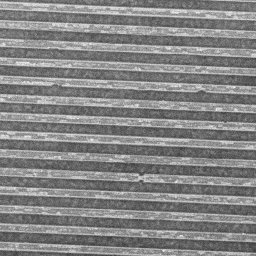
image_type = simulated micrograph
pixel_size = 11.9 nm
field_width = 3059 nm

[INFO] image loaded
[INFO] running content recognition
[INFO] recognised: parallel lines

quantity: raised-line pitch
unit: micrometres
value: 0.221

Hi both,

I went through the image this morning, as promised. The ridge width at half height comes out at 80.6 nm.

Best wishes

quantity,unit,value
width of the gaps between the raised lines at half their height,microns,0.137